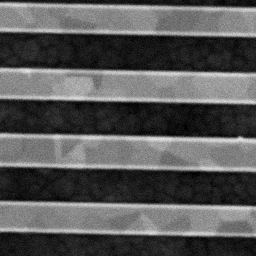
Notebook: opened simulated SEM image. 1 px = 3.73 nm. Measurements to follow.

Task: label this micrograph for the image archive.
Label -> one or a few lines or trenches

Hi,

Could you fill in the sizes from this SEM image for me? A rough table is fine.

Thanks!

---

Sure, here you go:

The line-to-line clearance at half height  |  0.137 µm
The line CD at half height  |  106 nanometres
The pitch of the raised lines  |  247 nm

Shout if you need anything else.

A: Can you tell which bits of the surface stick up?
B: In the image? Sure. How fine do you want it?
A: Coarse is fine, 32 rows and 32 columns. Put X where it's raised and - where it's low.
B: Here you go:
X-------------------------------
XXXXXXXXXXXXXXXXXXXXXXXXXXXXXXXX
XXXXXXXXXXXXXXXXXXXXXXXXXXXXXXXX
XXXXXXXXXXXXXXXXXXXXXXXXXXXXXXXX
--------------------------------
--------------------------------
--------------------------------
--------------------------------
--------------------------------
XXXXXXXXXXXXXXXXXXXXXXXXXXXXXXXX
XXXXXXXXXXXXXXXXXXXXXXXXXXXXXXXX
XXXXXXXXXXXXXXXXXXXXXXXXXXXXXXXX
---------------XXXXXXXXXXXXXXXXX
--------------------------------
--------------------------------
--------------------------------
--------------------------------
XXXXXXXXXXXXXXXXXXXXXXXXXXXXXXX-
XXXXXXXXXXXXXXXXXXXXXXXXXXXXXXXX
XXXXXXXXXXXXXXXXXXXXXXXXXXXXXXXX
XXXXXXXXXXXXXXXXXXXXXXXXXXXXXXXX
--------------------------------
--------------------------------
--------------------------------
--------------------------------
XXXXXXXXXX----------------------
XXXXXXXXXXXXXXXXXXXXXXXXXXXXXXXX
XXXXXXXXXXXXXXXXXXXXXXXXXXXXXXXX
XXXXXXXXXXXXXXXXXXXXXXXXXXXXXXXX
--------------------------------
--------------------------------
--------------------------------